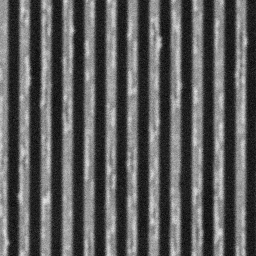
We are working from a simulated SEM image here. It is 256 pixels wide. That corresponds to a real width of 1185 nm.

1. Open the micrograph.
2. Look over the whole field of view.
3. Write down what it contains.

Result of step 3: parallel lines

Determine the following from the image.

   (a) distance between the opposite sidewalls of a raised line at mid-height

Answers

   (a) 38.8 nanometres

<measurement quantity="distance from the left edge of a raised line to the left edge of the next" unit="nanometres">100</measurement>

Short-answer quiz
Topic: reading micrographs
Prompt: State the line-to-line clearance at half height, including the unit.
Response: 0.0596 µm